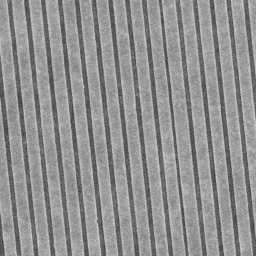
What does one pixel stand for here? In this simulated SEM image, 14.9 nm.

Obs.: parallel lines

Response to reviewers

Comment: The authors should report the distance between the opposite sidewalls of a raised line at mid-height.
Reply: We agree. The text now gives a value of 0.171 µm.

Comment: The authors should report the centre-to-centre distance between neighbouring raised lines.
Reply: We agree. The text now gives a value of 16.8 pixels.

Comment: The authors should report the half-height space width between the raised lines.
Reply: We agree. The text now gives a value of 78 nanometers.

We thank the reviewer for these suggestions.